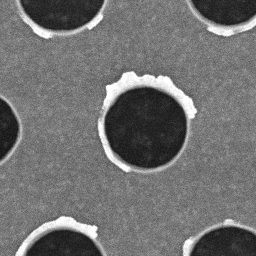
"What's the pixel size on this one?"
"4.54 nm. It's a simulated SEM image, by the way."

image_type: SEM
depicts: holes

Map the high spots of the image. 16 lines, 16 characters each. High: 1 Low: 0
1000001111110000
1100011111111001
1111111111111111
1111111111111111
1111111111111111
1111111100111111
1111111000011111
0111111000001111
0111111000001111
0111111000011111
1111111100111111
1111111111111111
1111111111111111
1111111111111111
1110011111111000
1100001111110000